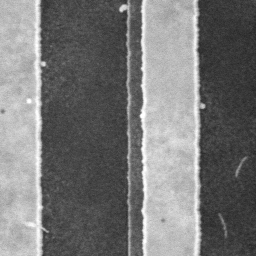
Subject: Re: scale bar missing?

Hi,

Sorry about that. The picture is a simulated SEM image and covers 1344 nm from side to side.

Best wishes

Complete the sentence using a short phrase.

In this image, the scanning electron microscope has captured lines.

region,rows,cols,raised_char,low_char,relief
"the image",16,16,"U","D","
UUDDDDDDUUUUDDDD
UUDDDDDDUUUUDDDD
UUDDDDDDUUUUDDDD
UUDDDDDDUUUUDDDD
UUDDDDDDUUUUDDDD
UUDDDDDDUUUUDDDD
UUDDDDDDUUUUDDDD
UUDDDDDDUUUUDDDD
UUDDDDDDUUUUDDDD
UUDDDDDDUUUUDDDD
UUDDDDDDUUUUDDDD
UUDDDDDDUUUUDDDD
UUUDDDDDUUUUDDDD
UUDDDDDDUUUUDDDD
UUUDDDDDUUUUDDDD
UUUDDDDDUUUUDDDD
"